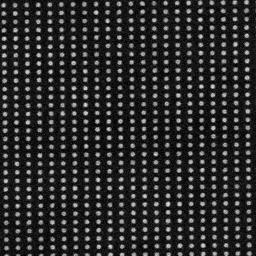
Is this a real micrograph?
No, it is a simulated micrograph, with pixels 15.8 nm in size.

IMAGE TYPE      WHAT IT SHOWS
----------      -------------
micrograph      a regular array of raised bodies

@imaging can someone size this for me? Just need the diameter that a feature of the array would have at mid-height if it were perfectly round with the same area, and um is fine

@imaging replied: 0.0644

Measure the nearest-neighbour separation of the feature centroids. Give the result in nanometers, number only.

131